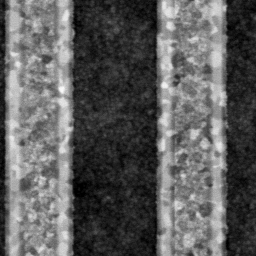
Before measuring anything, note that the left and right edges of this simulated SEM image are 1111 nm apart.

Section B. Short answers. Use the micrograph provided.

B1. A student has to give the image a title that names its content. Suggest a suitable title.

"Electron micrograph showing one or a few lines or trenches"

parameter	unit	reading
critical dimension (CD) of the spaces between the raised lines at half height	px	102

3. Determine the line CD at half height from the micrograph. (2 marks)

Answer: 218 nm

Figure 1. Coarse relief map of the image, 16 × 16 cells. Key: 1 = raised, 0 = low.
0111000000111100
0111000000111100
0111000000111100
0111000000111100
0111000000111100
0111000000111100
0111000000111100
0111000000111100
0111000000111100
0111000000111100
0111000000111100
0111000000111100
0111000000111100
0111000000111100
0111000000111100
0111000000111100